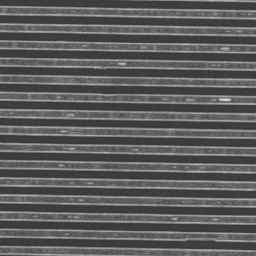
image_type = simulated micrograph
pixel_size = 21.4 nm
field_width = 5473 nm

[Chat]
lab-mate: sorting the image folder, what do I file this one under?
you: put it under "parallel lines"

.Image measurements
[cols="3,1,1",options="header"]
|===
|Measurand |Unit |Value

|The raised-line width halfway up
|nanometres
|174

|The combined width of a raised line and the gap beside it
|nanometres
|366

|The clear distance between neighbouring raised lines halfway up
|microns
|0.192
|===